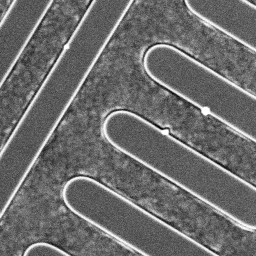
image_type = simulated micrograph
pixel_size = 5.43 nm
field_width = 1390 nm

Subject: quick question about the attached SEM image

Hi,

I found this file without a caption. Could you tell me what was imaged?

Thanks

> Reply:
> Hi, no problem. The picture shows groups of lines, slits or small figures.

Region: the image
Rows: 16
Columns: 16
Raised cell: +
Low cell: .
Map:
.++...++....++++
++...++......+++
++..+++........+
+...++...+++....
+..+++...++++...
...++.....+++++.
..++........++++
.+++...++.....++
.++....++++....+
+++.....++++....
++.......+++++..
+...++.....+++++
+...++++.....+++
.....+++++....++
.......++++.....
..++....+++++...